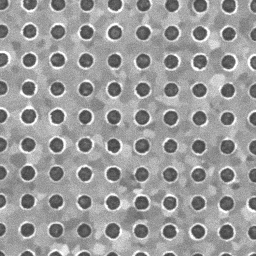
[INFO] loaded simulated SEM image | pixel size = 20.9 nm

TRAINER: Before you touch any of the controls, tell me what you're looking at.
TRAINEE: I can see a regular array of holes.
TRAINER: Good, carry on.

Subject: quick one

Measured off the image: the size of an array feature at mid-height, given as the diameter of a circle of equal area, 0.312 micrometres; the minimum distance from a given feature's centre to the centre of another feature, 584 nm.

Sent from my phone